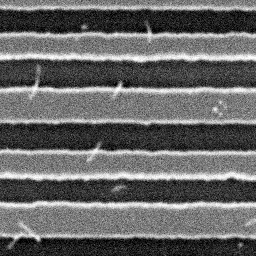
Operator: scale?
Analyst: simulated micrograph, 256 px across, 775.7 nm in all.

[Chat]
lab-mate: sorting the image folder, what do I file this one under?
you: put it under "lines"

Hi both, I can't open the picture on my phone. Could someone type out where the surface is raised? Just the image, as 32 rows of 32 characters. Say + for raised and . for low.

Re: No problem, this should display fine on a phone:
++++++++++++++++++++++++++++++++
................................
................................
................................
++++++++++++++++++++++++++++++++
++++++++++++++++++++++++++++++++
++++++++++++++++++++++++++++++++
................+++............+
................................
................................
................................
++++++++++++++++++++++++++++++++
++++++++++++++++++++++++++++++++
++++++++++++++++++++++++++++++++
++++++++++++++++++++++++++++++++
................................
................................
................................
................................
++++++++++++++++++++++++++++++++
++++++++++++++++++++++++++++++++
++++++++++++++++++++++++++++++++
................................
................................
................................
+...++++++.++..+++.+....++++...+
++++++++++++++++++++++++++++++++
++++++++++++++++++++++++++++++++
++++++++++++++++++++++++++++++++
++++++++++++++++++++++++++++++++
................................
................................